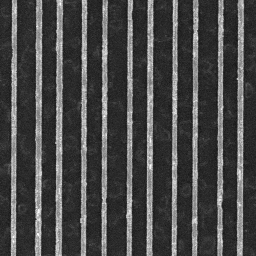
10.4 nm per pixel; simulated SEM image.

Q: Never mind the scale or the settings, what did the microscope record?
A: parallel lines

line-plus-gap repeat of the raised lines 235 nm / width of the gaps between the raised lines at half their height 0.18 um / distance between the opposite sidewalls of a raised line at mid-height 49.2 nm